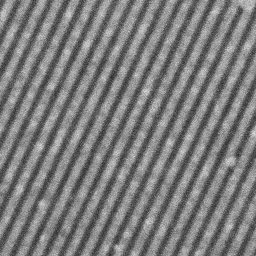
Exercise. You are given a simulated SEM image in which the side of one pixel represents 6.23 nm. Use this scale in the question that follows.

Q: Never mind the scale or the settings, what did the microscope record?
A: parallel lines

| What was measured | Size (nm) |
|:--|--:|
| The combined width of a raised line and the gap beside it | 91.3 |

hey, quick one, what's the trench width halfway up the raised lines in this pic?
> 48 nm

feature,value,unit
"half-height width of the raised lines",0.0437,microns